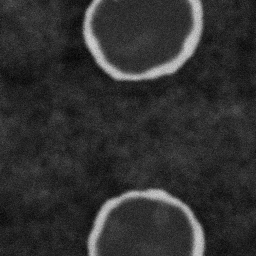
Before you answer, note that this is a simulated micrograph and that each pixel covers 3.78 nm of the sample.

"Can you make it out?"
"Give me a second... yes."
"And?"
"raised bodies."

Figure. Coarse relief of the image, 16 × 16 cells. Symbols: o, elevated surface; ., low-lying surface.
......oooooo....
.....ooooooo....
......oooooo....
......oooooo....
.......ooo......
................
................
................
................
................
................
................
.......oooo.....
......oooooo....
......oooooo....
......oooooo....